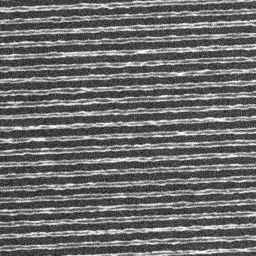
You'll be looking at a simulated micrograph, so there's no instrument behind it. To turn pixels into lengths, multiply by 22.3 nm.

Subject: parallel lines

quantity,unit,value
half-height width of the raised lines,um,0.0865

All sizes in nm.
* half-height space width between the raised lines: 173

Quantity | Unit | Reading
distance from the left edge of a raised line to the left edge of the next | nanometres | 266